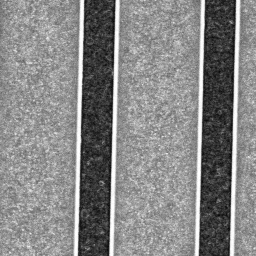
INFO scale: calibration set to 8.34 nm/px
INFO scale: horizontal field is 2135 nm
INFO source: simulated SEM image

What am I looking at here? one or a few lines or trenches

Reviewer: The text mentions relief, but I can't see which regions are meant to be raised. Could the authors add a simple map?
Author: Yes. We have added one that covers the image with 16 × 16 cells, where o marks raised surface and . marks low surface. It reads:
ooooo..oooooo..o
ooooo..oooooo..o
ooooo..oooooo..o
ooooo..oooooo..o
ooooo..oooooo..o
ooooo..oooooo..o
ooooo..oooooo..o
ooooo..oooooo..o
ooooo..ooooo...o
ooooo..ooooo...o
ooooo..ooooo...o
ooooo..ooooo...o
ooooo..ooooo...o
ooooo..ooooo...o
ooooo..ooooo...o
ooooo..ooooo...o